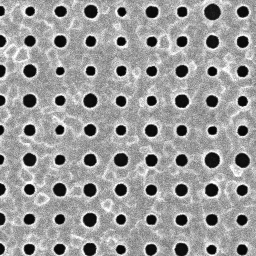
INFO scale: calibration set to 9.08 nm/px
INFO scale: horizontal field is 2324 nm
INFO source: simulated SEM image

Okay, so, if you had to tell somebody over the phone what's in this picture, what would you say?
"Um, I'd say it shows a regular array of holes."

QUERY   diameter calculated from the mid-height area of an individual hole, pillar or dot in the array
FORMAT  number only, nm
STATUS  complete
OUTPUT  106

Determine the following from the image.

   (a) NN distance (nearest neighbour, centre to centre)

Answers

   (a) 269 nanometers